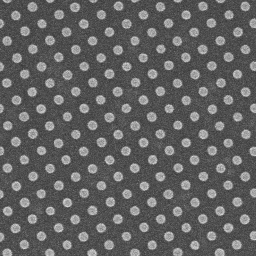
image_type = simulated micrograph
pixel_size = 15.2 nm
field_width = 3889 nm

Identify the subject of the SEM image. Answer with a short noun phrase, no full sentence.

a regular array of raised bodies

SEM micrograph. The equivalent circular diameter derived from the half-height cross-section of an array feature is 8.74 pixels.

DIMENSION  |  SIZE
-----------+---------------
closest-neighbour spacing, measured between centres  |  281 nm